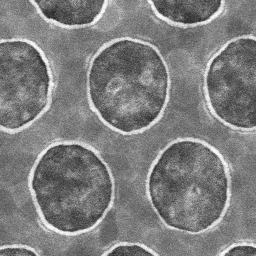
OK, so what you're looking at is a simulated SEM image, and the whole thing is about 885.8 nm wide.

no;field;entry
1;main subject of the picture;holes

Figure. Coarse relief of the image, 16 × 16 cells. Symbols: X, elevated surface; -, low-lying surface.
XX----XXXX----XX
XXXX-XXXXXX-XXXX
XXXXXXXXXXXXXXX-
---XXX----XXXX--
---XXX----XXX---
---XXX----XXX---
---XXX----XXX---
--XXXXX---XXXX--
XXXXXXXXXXXXXXXX
XXX---XXXX---XXX
XX-----XXX----XX
XX-----XX-----XX
XX-----XX-----XX
XXX---XXXX----XX
XXXX-XXXXXXXXXXX
XXXXXXX--XXXXXX-